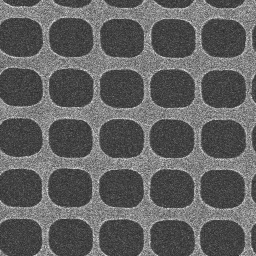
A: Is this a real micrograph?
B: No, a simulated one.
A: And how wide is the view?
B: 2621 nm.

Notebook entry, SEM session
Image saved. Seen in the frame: a regular array of holes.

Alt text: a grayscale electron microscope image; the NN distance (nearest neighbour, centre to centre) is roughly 0.512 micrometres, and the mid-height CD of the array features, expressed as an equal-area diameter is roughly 0.448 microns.